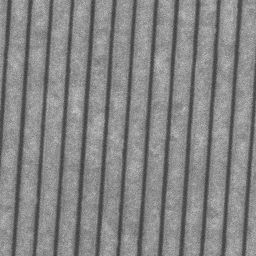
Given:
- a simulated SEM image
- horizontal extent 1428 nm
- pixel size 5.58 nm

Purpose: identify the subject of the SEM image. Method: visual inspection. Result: parallel lines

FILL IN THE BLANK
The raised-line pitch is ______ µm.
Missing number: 0.117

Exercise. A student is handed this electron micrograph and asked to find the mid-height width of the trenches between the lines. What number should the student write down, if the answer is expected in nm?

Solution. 30.6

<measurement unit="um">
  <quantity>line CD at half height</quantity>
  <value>0.0869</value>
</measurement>